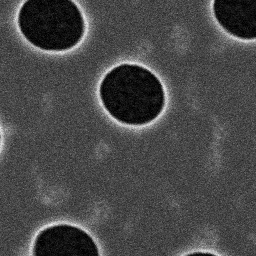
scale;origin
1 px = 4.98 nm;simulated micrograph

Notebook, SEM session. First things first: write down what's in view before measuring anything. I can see holes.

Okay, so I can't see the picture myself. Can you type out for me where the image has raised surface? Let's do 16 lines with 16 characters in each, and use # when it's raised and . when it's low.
#....########...
#....#########..
##...###########
################
#######..#######
######....######
######....######
#######..#######
################
################
################
################
################
################
###..###########
##....##########